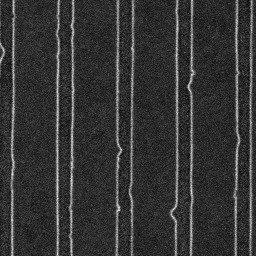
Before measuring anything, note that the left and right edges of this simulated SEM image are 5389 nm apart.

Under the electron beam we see parallel lines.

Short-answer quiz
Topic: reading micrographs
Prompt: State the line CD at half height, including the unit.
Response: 958 nanometers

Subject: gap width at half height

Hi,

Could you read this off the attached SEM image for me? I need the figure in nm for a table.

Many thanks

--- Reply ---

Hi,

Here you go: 292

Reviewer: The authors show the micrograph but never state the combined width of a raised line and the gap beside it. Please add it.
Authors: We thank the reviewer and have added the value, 1250 nm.